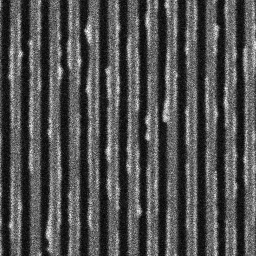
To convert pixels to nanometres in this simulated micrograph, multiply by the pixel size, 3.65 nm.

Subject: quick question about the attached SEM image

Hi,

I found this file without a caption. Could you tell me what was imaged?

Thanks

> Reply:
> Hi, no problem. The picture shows parallel lines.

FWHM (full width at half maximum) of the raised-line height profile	40.6	nanometres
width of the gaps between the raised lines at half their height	30.1	nanometres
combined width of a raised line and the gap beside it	0.0711	µm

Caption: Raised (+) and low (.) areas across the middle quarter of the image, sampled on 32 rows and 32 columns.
.+++..+++..+++..+++..++...++...+
.+++..+++..+++..+++..++...++...+
.+++..+++..+++..+++..++..++++..+
.+++..+++..+++..+++..++..++++..+
.+++..+++..+++..+++..++...++...+
.+++..+++..+++..+++..++...++...+
.+++..+++..+++..+++..++...++...+
.+++..+++..+++..+++..++...++...+
.+++..+++..+++..+++..++..+++...+
.+++..+++..+++..+++..++..+++...+
.+++..+++..+++..+++..++..+++...+
.+++..+++..+++..+++..++..+++..++
.+++..+++..+++..+++..++..+++..++
.+++..+++..+++..+++.+++..+++...+
.+++..+++..+++..+++.+++..+++...+
.+++..+++..+++..+++..++...++...+
.+++..+++..+++..+++..++...++...+
.+++..+++..+++..+++.+++...++...+
.+++..+++..+++..+++.+++...++...+
.+++..+++..+++..+++..++...++...+
.+++..+++..+++..+++..++...++...+
.+++..+++..+++..+++..++...++...+
.+++..+++..+++..+++..++...++...+
.+++..+++..+++..+++..++...++...+
.+++..+++..+++..+++..++...++...+
.+++..+++..+++..+++..++...++...+
.+++..+++..+++..+++..++...++...+
.+++..+++..+++..+++..++...++...+
.+++..+++..+++..+++..++...++...+
.+++..+++..+++..+++..++...++...+
.+++..+++..+++..+++..++...++...+
.+++..+++..+++..+++..++...++...+